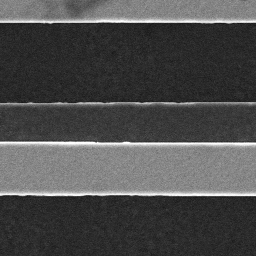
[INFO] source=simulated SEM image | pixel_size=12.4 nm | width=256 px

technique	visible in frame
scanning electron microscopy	lines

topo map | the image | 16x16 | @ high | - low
@@@@@@@@@@@@@@@@
----------------
----------------
----------------
----------------
----------------
@@@@@@@@@@@@@@@@
@@@@@@@@@@@@@@@@
@@@@@@@@@@@@@@@@
@@@@@@@@@@@@@@@@
@@@@@@@@@@@@@@@@
@@@@@@@@@@@@@@@@
----------------
----------------
----------------
----------------